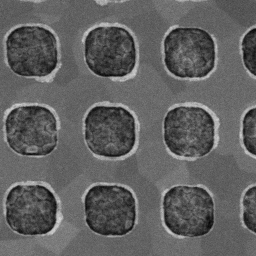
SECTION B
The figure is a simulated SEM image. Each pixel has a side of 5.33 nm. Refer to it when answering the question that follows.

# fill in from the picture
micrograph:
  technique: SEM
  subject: a regular array of holes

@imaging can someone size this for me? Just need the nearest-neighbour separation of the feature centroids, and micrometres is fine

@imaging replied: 0.419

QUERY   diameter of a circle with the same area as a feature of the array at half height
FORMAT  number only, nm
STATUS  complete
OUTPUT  285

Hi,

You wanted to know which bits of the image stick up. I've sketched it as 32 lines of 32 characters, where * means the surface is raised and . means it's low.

********************************
********************************
********************************
**....******...********.********
*......****......****.....*****.
*......****......***.......***..
*......****......****......***..
*......****......****......***..
*......****......****......****.
***...******....******....******
********************************
********************************
********************************
**....******...*******...*******
*......****......****.....*****.
*......****......***.......***..
*......****......***.......***..
*......****......****......***..
*......****......****......****.
****.********..*******...*******
********************************
********************************
********************************
**....*****.....*****....******.
*......****......****.....****..
*......****......***.......***..
*......****......***.......***..
*......****......****......***..
*......****......****.....*****.
***********************..*******
********************************
********************************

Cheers